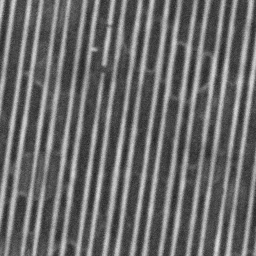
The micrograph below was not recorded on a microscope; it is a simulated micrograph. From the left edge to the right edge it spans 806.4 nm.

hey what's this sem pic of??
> parallel lines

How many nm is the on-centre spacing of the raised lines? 43.3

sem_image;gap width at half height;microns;0.0285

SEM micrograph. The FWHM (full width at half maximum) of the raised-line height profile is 0.0113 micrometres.